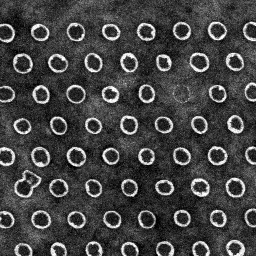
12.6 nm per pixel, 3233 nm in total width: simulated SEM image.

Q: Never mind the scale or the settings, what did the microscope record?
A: a regular array of raised bodies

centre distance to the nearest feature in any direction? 444 nm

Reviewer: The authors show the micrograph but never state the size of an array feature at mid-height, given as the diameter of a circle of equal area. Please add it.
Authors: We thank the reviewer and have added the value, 218 nm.